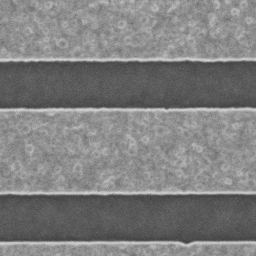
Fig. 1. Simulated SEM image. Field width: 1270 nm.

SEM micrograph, one or a few lines or trenches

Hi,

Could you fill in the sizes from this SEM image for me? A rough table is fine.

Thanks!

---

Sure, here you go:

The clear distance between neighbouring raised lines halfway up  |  245 nm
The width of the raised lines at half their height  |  417 nm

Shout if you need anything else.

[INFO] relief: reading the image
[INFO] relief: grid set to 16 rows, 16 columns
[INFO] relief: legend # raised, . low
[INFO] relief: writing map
################
################
################
################
................
................
................
################
################
################
################
################
................
................
................
################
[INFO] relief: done